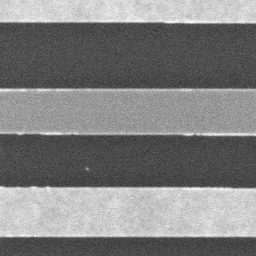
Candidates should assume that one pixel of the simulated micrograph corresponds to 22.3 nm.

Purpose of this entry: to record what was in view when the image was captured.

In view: lines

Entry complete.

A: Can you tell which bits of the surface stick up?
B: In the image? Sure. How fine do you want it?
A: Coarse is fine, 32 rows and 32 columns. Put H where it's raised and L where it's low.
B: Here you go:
HHHHHHHHHHHHHHHHHHHHHHHHHHHHHHHH
HHHHHHHHHHHHHHHHHHHHHHHHHHHHHHHH
HHHHHHHHHHHHHHHHHHHHHHHHHHHHHHHH
LLLLLLLLLLLLLLLLLLLLLLLLLLLLLLLL
LLLLLLLLLLLLLLLLLLLLLLLLLLLLLLLL
LLLLLLLLLLLLLLLLLLLLLLLLLLLLLLLL
LLLLLLLLLLLLLLLLLLLLLLLLLLLLLLLL
LLLLLLLLLLLLLLLLLLLLLLLLLLLLLLLL
LLLLLLLLLLLLLLLLLLLLLLLLLLLLLLLL
LLLLLLLLLLLLLLLLLLLLLLLLLLLLLLLL
LLLLLLLLLLLLLLLLLLLLLLLLLLLLLLLL
HHHHHHHHHHHHHHHHHHHHHHHHHHHHHHHH
HHHHHHHHHHHHHHHHHHHHHHHHHHHHHHHH
HHHHHHHHHHHHHHHHHHHHHHHHHHHHHHHH
HHHHHHHHHHHHHHHHHHHHHHHHHHHHHHHH
HHHHHHHHHHHHHHHHHHHHHHHHHHHHHHHH
HHHHHHHHHHHHHHHHHHHHHHHHHHHHHHHH
LLLLLLLLLLLLLLLLLLLLLLLLLLLLLLLL
LLLLLLLLLLLLLLLLLLLLLLLLLLLLLLLL
LLLLLLLLLLLLLLLLLLLLLLLLLLLLLLLL
LLLLLLLLLLLLLLLLLLLLLLLLLLLLLLLL
LLLLLLLLLLLLLLLLLLLLLLLLLLLLLLLL
LLLLLLLLLLLLLLLLLLLLLLLLLLLLLLLL
HLLHHHHLLLLLLLLLLLLLLLLLLLLLLLLL
HHHHHHHHHHHHHHHHHHHHHHHHHHHHHHHH
HHHHHHHHHHHHHHHHHHHHHHHHHHHHHHHH
HHHHHHHHHHHHHHHHHHHHHHHHHHHHHHHH
HHHHHHHHHHHHHHHHHHHHHHHHHHHHHHHH
HHHHHHHHHHHHHHHHHHHHHHHHHHHHHHHH
HHHHHHHHHHHHHHHHHHHHHHHHHHHHHHHH
LLLLLLLLLLLLLLLLLLLLLLLLLLLLLLLL
LLLLLLLLLLLLLLLLLLLLLLLLLLLLLLLL